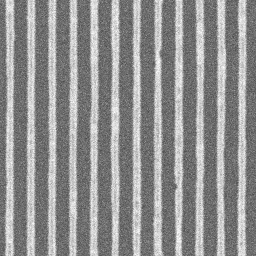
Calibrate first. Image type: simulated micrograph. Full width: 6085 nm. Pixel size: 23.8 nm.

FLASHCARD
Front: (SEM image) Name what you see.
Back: parallel lines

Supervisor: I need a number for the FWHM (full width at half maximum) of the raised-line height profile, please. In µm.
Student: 0.125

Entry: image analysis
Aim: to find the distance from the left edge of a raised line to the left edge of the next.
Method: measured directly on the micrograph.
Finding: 502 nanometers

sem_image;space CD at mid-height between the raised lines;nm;374